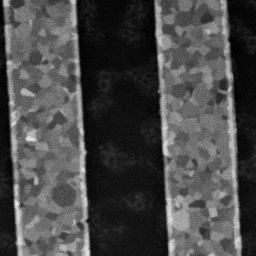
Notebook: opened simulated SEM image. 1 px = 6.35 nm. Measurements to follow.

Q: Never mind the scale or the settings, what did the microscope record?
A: one or a few lines or trenches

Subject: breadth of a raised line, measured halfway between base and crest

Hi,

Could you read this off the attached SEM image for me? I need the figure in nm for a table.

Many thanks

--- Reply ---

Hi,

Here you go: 426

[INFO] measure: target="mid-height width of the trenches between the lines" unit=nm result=528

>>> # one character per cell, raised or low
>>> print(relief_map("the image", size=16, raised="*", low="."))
*****.....****..
*****.....****..
.****.....****..
.****.....****..
.****.....****..
.****.....****..
.****.....****..
.****.....****..
.****.....*****.
.****.....*****.
.****.....*****.
.****.....*****.
.****......****.
.****......****.
.****......****.
.****......****.